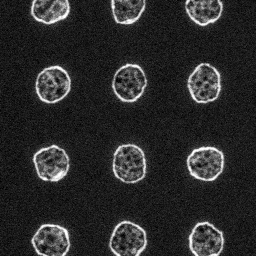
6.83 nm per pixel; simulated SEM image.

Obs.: raised bodies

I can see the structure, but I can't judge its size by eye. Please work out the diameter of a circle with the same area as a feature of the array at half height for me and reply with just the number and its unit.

233 nanometres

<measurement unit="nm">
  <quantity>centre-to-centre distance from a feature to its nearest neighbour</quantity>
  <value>522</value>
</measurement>